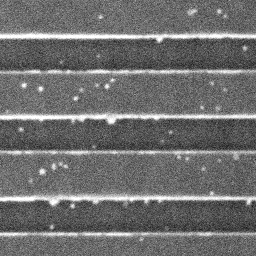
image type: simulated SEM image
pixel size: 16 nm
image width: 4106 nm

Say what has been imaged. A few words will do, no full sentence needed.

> lines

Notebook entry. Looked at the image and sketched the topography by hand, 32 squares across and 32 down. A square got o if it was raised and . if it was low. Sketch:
oooooooooooooooooooooooooooooooo
oooooooooooooooooooooooooooooooo
oooooooooooooooooooooooooooooooo
oooooooooooooooooooooooooooooooo
oooooooooooooooooooooooooooooooo
................................
................................
................................
................................
oooooooooooooooooooooooooooooooo
oooooooooooooooooooooooooooooooo
oooooooooooooooooooooooooooooooo
oooooooooooooooooooooooooooooooo
oooooooooooooooooooooooooooooooo
oooooooooooooooooooooooooooooooo
................................
................................
................................
................................
oooooooooooooooooooooooooooooooo
oooooooooooooooooooooooooooooooo
oooooooooooooooooooooooooooooooo
oooooooooooooooooooooooooooooooo
oooooooooooooooooooooooooooooooo
oooooooooooooooooooooooooooooooo
................................
................................
................................
................................
oooooooooooooooooooooooooooooooo
oooooooooooooooooooooooooooooooo
oooooooooooooooooooooooooooooooo